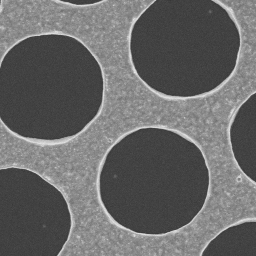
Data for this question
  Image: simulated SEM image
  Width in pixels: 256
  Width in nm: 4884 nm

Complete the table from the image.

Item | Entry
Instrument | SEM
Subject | holes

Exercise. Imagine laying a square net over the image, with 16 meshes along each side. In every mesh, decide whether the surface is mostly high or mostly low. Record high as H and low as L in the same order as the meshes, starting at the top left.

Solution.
HHHHHHHHHLLLLLHH
HHHHHHHHLLLLLLLH
HLLLLHHHLLLLLLLH
LLLLLLHHLLLLLLLH
LLLLLLHHHLLLLLHH
LLLLLLHHHLLLLHHH
LLLLLLHHHHHHHHHL
LLLLLLHHHHHHHHHL
HLLLLHHHLLLHHHLL
HHHHHHHLLLLLLHHL
HHHHHHLLLLLLLHHL
LLLHHHLLLLLLLHHH
LLLLHHLLLLLLLHHH
LLLLHHHLLLLLHHHH
LLLLHHHHLLLHHHLL
LLLLHHHHHHHHHLLL